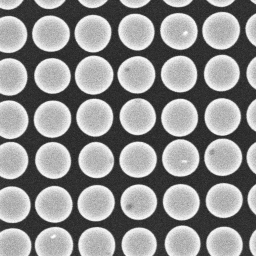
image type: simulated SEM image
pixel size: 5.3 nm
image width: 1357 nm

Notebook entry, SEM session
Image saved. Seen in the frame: an array of small figures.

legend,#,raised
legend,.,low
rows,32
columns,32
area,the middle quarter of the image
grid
#..#########..########...#######
#..#########..########..########
#..#########..#########.########
#..#########..#########.########
#..#########..########...#######
#..########....#######....######
....######......#####......####.
.......#........................
................................
.....#####......#####......####.
....#######....#######...#######
#...########..########...#######
##.#########..#########.########
##.#########..#########.########
##.#########..#########.########
#...########...#######...#######
#...#######.....#####.....######
......####.......###.......####.
................................
...........................####.
.....#####......#####.....######
#...########...#######...#######
#...########..#########..#######
##..########..#########..#######
##..########..#########..#######
##..########..#########..#######
#...########...#######....######
.....######.....#####......####.
................................
................................
.......##........###.......####.
.....######....#######....######